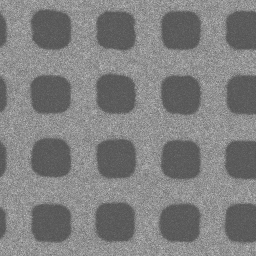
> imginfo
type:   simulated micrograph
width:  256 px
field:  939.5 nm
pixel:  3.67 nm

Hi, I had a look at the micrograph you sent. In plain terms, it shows a regular array of holes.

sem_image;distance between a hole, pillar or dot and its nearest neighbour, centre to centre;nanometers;233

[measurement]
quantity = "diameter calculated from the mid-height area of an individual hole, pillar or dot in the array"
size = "153 nm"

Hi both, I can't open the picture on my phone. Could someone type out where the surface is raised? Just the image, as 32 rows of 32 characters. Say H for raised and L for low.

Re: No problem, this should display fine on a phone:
HHHHHHHHHHHHHHHHHHHHHHHHHHHHHHHH
HHHHHLLLHHHHHLLHHHHHHLLLHHHHHLLL
LHHHLLLLLHHHLLLLLHHHLLLLLHHHLLLL
LHHHLLLLLHHHLLLLLHHHLLLLLHHHLLLL
LHHHLLLLLHHHLLLLLHHHLLLLLHHHLLLL
HHHHHLLLHHHHLLLLLHHHHLLLLHHHHLLL
HHHHHHHHHHHHHHHHHHHHHHHHHHHHHHHH
HHHHHHHHHHHHHHHHHHHHHHHHHHHHHHHH
HHHHHHHHHHHHHHHHHHHHHHHHHHHHHHHH
HHHHHLLHHHHHHLLLHHHHHHLLHHHHHLLL
LHHHLLLLLHHHLLLLLHHHLLLLLHHHLLLL
LHHHLLLLLHHHLLLLLHHHLLLLLHHHLLLL
LHHHLLLLLHHHLLLLLHHHLLLLLHHHLLLL
LHHHLLLLLHHHLLLLLHHHHLLLLHHHHLLL
HHHHHHHHHHHHHHHHHHHHHHHHHHHHHHHH
HHHHHHHHHHHHHHHHHHHHHHHHHHHHHHHH
HHHHHHHHHHHHHHHHHHHHHHHHHHHHHHHH
HHHHHLLLHHHHHHLLHHHHHHHHHHHHHHHH
LHHHLLLLLHHHLLLLLHHHLLLLLHHHLLLL
LHHHLLLLLHHHLLLLLHHHLLLLLHHHLLLL
LHHHLLLLLHHHLLLLLHHHLLLLLHHHLLLL
LHHHLLLLLHHHLLLLLHHHLLLLLHHHLLLL
HHHHHHHHHHHHHHHHHHHHHHHHHHHHHHHH
HHHHHHHHHHHHHHHHHHHHHHHHHHHHHHHH
HHHHHHHHHHHHHHHHHHHHHHHHHHHHHHHH
HHHHHLLHHHHHHLLLHHHHHHLLHHHHHLLH
LHHHLLLLLHHHLLLLLHHHLLLLLHHHLLLL
LHHHLLLLLHHHLLLLLHHHLLLLLHHHLLLL
LHHHLLLLLHHHLLLLLHHHLLLLLHHHLLLL
HHHHLLLLLHHHLLLLLHHHLLLLLHHHLLLL
HHHHHHHHHHHHHHHHHHHHHHHHHHHHHHHH
HHHHHHHHHHHHHHHHHHHHHHHHHHHHHHHH